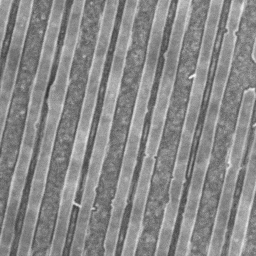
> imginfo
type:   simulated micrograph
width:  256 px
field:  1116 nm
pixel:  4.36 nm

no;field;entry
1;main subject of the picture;parallel lines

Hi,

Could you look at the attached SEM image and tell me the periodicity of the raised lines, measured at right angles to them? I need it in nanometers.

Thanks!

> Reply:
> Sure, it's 112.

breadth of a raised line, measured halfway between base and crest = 11.9 pixels